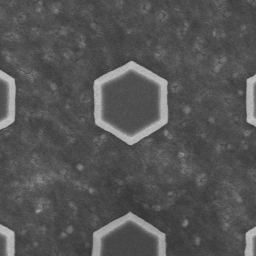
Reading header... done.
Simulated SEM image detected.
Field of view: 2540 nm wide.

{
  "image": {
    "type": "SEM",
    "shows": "raised bodies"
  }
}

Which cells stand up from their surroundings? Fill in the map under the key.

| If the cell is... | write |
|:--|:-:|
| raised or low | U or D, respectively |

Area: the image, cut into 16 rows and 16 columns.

DDDDDDDDDDDDDDDD
DDDDDDDDDDDDDDDD
DDDDDDDDDDDDDDDD
DDDDDDDDDDDDDDDD
DDDDDDDUUDDDDDDD
UDDDDDUUUUDDDDDD
UDDDDDUUUUDDDDDD
UDDDDDUUUUDDDDDD
DDDDDDDDUDDDDDDD
DDDDDDDDDDDDDDDD
DDDDDDDDDDDDDDDD
DDDDDDDDDDDDDDDD
DDDDDDDDDDDDDDDD
DDDDDDDDDDDDDDDD
DDDDDDUUUUDDDDDD
UDDDDDUUUUDDDDDD